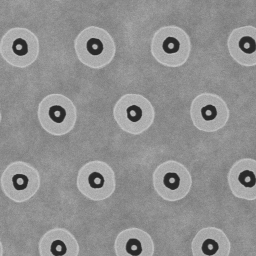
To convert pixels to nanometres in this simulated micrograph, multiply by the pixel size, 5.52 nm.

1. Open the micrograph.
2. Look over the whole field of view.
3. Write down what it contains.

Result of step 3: ring-shaped raised bodies with a dot in the middle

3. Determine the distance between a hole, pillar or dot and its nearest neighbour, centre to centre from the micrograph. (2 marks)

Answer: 0.418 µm